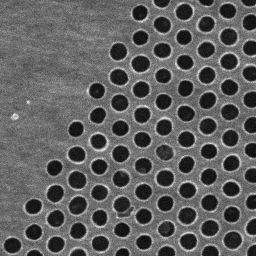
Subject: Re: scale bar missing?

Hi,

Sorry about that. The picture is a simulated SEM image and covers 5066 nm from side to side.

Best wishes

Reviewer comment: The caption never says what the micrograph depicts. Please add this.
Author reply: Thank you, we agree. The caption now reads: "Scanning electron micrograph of a regular array of holes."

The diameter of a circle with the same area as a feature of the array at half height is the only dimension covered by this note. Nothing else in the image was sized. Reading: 335 nm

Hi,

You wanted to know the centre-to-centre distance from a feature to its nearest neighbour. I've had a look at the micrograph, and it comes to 497 nm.